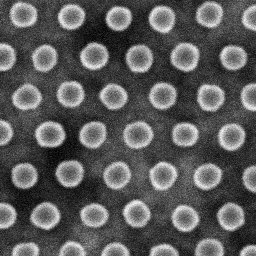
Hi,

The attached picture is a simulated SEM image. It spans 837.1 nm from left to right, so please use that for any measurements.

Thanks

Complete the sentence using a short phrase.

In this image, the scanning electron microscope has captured a regular array of raised bodies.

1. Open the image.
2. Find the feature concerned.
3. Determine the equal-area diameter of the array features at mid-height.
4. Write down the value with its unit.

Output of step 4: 0.0817 µm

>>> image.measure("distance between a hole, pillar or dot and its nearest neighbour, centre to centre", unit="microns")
0.145